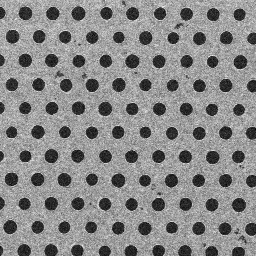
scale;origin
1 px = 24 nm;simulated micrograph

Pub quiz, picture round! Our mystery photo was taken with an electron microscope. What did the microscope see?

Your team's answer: a regular array of holes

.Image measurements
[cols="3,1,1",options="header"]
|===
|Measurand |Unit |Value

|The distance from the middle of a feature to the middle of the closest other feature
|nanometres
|635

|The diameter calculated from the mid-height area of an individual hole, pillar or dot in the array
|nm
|324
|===